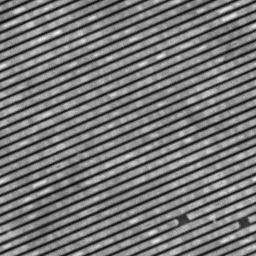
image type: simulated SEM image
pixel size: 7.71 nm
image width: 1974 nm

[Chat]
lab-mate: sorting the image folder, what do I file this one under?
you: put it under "parallel lines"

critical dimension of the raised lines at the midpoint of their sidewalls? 0.0524 um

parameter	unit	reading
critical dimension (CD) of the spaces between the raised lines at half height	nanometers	19.5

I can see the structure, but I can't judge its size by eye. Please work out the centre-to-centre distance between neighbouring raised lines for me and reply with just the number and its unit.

68.2 nm